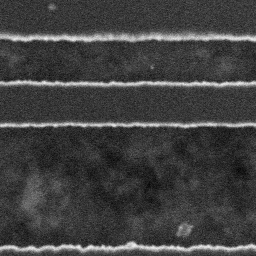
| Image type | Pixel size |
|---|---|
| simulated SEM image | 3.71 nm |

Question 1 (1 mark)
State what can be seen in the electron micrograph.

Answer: lines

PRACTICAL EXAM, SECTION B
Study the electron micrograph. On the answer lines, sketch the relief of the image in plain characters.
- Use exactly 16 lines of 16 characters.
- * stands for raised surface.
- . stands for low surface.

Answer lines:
****************
****************
................
................
................
****************
****************
****************
................
................
................
................
................
................
................
*.**************